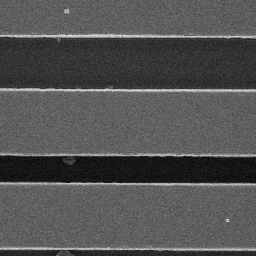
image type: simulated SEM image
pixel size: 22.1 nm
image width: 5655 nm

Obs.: lines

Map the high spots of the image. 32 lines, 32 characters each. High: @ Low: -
@@@@@@@@@@@@@@@@@@@@@@@@@@@@@@@@
@@@@@@@@@@@@@@@@@@@@@@@@@@@@@@@@
@@@@@@@@@@@@@@@@@@@@@@@@@@@@@@@@
@@@@@@@@@@@@@@@@@@@@@@@@@@@@@@@@
@@@@@@@@@@@@@@@@@@@@@@@@@@@@@@@@
--------------------------------
--------------------------------
--------------------------------
--------------------------------
--------------------------------
--------------------------------
@@@@@@@@@@@@@@@@@@@@@@@@@@@@@@@@
@@@@@@@@@@@@@@@@@@@@@@@@@@@@@@@@
@@@@@@@@@@@@@@@@@@@@@@@@@@@@@@@@
@@@@@@@@@@@@@@@@@@@@@@@@@@@@@@@@
@@@@@@@@@@@@@@@@@@@@@@@@@@@@@@@@
@@@@@@@@@@@@@@@@@@@@@@@@@@@@@@@@
@@@@@@@@@@@@@@@@@@@@@@@@@@@@@@@@
@@@@@@@@@@@@@@@@@@@@@@@@@@@@@@@@
---------------------------@@@@@
--------------------------------
--------------------------------
--------------------------------
@@@@@@@@@@@@@@@@@@@@@@@@@@@@@@@@
@@@@@@@@@@@@@@@@@@@@@@@@@@@@@@@@
@@@@@@@@@@@@@@@@@@@@@@@@@@@@@@@@
@@@@@@@@@@@@@@@@@@@@@@@@@@@@@@@@
@@@@@@@@@@@@@@@@@@@@@@@@@@@@@@@@
@@@@@@@@@@@@@@@@@@@@@@@@@@@@@@@@
@@@@@@@@@@@@@@@@@@@@@@@@@@@@@@@@
@@@@@@@@@@@@@@@@@@@@@@@@@@@@@@@@
--------------------------------